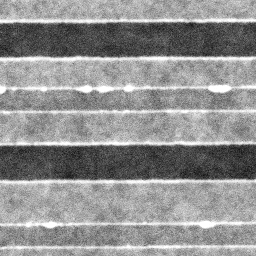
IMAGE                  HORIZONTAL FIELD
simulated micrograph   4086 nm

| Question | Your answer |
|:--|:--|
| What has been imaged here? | lines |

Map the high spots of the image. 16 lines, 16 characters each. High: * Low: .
****************
................
................
................
****************
****************
****************
****************
****************
................
................
****************
****************
****************
****************
****************